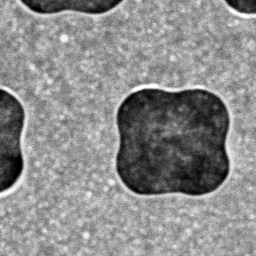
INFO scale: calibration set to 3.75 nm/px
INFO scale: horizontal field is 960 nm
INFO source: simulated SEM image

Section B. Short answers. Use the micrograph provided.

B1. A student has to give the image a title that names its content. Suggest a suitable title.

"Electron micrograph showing holes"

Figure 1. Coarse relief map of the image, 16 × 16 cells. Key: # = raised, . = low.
##.....#######..
################
################
################
################
################
.#######......##
..#####.......##
.######.......##
.######.......##
..#####.......##
.#######......##
################
################
################
################